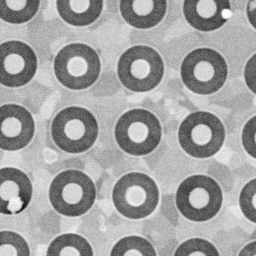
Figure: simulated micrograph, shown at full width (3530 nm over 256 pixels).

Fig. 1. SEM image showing an array of small figures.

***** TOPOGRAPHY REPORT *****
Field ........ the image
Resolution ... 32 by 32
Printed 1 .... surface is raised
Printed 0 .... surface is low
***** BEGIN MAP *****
00000110000001100000011000000110
00000110000001100000011000001110
00001111000011110000111000001110
11111111111111111001111100001111
11111111111111111111111111111111
00011111000111111111111111111111
00001110000011100000111100011111
00000110000001100000111000001110
00000110000001100000011000001100
00001110000011100000111000001100
00011111000011100000111000001110
11111111111111111011111100011110
11111111111111111111111111111111
00011111000111111111111111111111
00001110000011100001111000011111
00001100000011000000110000001110
00001100000011000000110000001100
00001110000011000000110000001100
00011110000111100000111000001100
11111111111111111011111100011110
11111111111111111111111111111111
00011111001111110011111111111111
00001110000011100001111000011110
00001100000011000000110000001100
00001100000011000000110000001100
01101100000011000000110000001100
01111110000111100001110000011100
11111111111111111111111100111110
11111111111111111111111111111111
00011110001111110111111111111111
00001100000111000001110000011110
00001100000011000000110000011100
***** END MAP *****